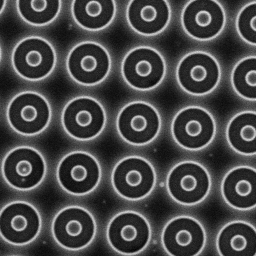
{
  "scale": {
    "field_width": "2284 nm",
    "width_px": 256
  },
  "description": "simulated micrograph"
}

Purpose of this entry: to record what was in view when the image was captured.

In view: an array of small figures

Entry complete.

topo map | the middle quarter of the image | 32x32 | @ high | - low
@----@@@---@@@@---@@@----@@@@---
@-----@----@@@@---@@@@---@@@----
@@---------@@@@----@@----@@@----
@@--------@@@@@----------@@@@---
@@@@-----@@@@@@@--------@@@@@---
@@@@@@@@@@@@@@@@@------@@@@@@---
@@@@@@@@@@@@@@@@@@@@@@@@@@@@@@--
@@@@@@@@@@@@@@@@@@@@@@@@@@@@@@@@
@@@@--@@@@@@@@@@@@@@@@@@@@@@@@@@
@@------@@@@@@@@@@@@@@@@@@@@@@@@
@--------@@@@@@@-----@@@@@@@@@@@
----------@@@@@--------@@@@@@@--
----@@----@@@@---------@@@@@----
---@@@@---@@@@----@@----@@@@----
---@@@----@@@----@@@----@@@-----
----------@@@@---@@@----@@@----@
@--------@@@@@----------@@@----@
@-------@@@@@@---------@@@@----@
@@@----@@@@@@@@-------@@@@@@----
@@@@@@@@@@@@@@@@-----@@@@@@@@---
@@@@@@@@@@@@@@@@@@@@@@@@@@@@@@--
@@@@@@@@@@@@@@@@@@@@@@@@@@@@@@@@
@@----@@@@@@@@@@@@@@@@@@@@@@@@@@
-------@@@@@@@@@---@@@@@@@@@@@@@
--------@@@@@@-------@@@@@@@@@@@
---------@@@@---------@@@@@@----
--@@@----@@@@---------@@@@@-----
--@@@----@@@----@@@----@@@@-----
--@@@----@@@----@@@----@@@----@@
--------@@@@----@@@---@@@@----@@
--------@@@@----------@@@@----@@
@------@@@@@@---------@@@@------